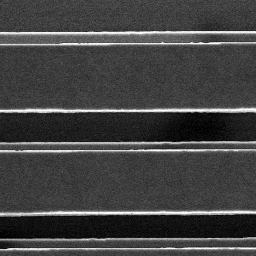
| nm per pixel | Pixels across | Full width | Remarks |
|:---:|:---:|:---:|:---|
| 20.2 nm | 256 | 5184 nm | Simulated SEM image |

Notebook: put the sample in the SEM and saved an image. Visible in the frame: lines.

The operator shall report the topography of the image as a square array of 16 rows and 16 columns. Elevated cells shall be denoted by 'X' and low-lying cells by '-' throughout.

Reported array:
----------------
----------------
----------------
XXXXXXXXXXXXXXXX
XXXXXXXXXXXXXXXX
XXXXXXXXXXXXXXXX
XXXXXXXXXXXXXXXX
----------------
----------------
XXXXXXXXXXXXXXXX
XXXXXXXXXXXXXXXX
XXXXXXXXXXXXXXXX
XXXXXXXXXXXXXXXX
----------------
----------------
----------------